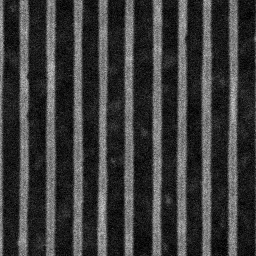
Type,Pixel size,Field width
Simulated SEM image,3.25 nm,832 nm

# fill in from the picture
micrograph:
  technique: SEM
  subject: parallel lines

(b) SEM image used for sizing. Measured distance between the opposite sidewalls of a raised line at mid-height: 7.23 px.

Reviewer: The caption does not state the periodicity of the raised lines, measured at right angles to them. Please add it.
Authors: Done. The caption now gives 84.8 nm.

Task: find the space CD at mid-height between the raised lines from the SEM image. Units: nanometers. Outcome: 59.2